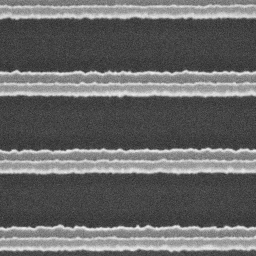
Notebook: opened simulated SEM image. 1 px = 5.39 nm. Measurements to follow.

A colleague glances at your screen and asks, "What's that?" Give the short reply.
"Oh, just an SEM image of lines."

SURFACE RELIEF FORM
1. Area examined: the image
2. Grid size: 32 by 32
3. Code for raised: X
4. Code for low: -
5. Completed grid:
XXXXXXXXXXXXXXXXXXXXXXXXXXXXXXXX
XXXXXXXXXXXXXXXXXXXXXXXXXXXXXXXX
--------------------------------
--------------------------------
--------------------------------
--------------------------------
--------------------------------
--------------------------------
--------------------------------
XXXXXXXXXXXXXXXXXXXXXXXXXXXXXXXX
XXXXXXXXXXXXXXXXXXXXXXXXXXXXXXXX
XXXXXXXXXXXXXXXXXXXXXXXXXXXXXXXX
--------------------------------
--------------------------------
--------------------------------
--------------------------------
--------------------------------
--------------------------------
--------------------------------
XXXXXXXXXXXXXXXXXXXXXXXXXXXXXXXX
XXXXXXXXXXXXXXXXXXXXXXXXXXXXXXXX
XXXXXXXXXXX----X-XX--XXXX---X---
--------------------------------
--------------------------------
--------------------------------
--------------------------------
--------------------------------
--------------------------------
-XXXXXXXXXX-X-XXXXXXXXXXXXX-XXXX
XXXXXXXXXXXXXXXXXXXXXXXXXXXXXXXX
XXXXXXXXXXXXXXXXXXXXXXXXXXXXXXXX
--------------------------------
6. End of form